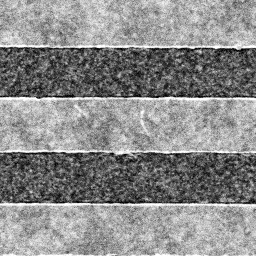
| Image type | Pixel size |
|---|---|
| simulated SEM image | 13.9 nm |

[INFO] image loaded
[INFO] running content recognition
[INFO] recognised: one or a few lines or trenches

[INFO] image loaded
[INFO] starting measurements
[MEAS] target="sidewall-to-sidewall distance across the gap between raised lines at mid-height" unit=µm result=0.71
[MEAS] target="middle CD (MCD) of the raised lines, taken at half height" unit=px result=53.7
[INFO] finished